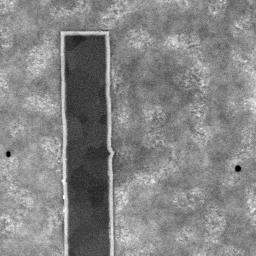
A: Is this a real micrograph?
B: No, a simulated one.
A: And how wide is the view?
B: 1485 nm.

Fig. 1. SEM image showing one or a few lines or trenches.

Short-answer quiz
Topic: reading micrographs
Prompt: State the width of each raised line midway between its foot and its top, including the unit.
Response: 265 nm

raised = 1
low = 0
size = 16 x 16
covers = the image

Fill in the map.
0000000000000000
0000000000000000
0000111000000000
0000111000000000
0000111000000000
0000111000000000
0000111000000000
0000111000000000
0000111000000000
0000111000000000
0000111000000000
0000111000000000
0000111000000000
0000111000000000
0000111000000000
0000111000000000